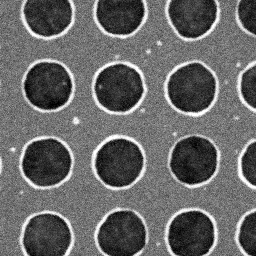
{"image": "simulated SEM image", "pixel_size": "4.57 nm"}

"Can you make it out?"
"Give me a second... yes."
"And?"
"holes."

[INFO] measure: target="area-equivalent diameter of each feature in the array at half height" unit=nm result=227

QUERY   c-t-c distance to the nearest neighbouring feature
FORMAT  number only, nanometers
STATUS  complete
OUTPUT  329